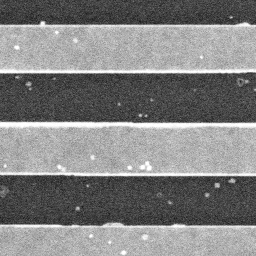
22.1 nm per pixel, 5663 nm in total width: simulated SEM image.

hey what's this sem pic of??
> lines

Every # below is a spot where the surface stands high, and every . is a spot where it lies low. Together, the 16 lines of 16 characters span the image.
................
................
################
################
###########..#..
................
................
................
################
################
################
................
................
................
################
################